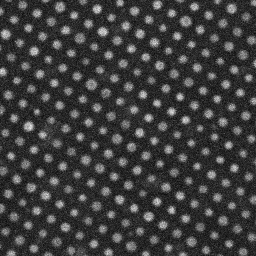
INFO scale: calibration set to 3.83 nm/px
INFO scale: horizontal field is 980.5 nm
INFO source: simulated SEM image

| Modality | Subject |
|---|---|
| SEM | a regular array of raised bodies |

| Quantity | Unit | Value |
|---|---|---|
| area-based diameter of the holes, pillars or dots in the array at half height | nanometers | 27.7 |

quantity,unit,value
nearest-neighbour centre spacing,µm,0.063